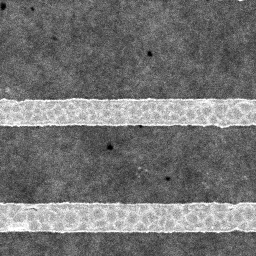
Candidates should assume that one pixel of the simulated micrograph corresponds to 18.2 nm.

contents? one or a few lines or trenches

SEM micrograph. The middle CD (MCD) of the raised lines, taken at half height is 24.9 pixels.